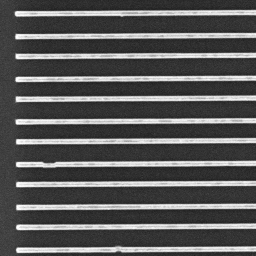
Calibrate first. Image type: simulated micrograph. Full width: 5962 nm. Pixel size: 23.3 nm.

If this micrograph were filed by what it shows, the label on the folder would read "parallel lines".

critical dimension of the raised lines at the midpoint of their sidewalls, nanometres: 87.3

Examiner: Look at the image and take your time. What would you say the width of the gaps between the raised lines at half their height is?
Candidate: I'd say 18.5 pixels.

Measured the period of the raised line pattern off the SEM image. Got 501 nanometres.